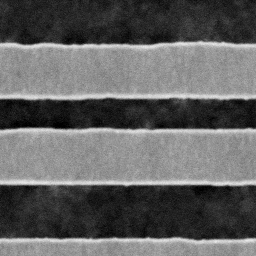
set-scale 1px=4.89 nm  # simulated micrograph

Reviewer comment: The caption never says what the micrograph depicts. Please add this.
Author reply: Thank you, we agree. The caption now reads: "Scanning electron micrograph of lines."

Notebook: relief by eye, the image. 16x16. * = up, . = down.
................
................
................
****************
****************
****************
................
................
****************
****************
****************
.***************
................
................
................
****************